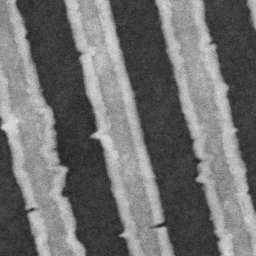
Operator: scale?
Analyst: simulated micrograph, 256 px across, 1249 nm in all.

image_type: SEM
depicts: one or a few lines or trenches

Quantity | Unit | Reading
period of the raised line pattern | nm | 432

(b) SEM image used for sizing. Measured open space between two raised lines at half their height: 285 nm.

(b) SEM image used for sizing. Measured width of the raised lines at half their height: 149 nanometres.